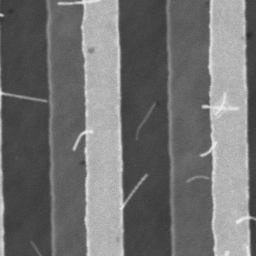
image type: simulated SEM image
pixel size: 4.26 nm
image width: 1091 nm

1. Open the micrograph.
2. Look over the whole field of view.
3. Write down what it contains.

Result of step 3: lines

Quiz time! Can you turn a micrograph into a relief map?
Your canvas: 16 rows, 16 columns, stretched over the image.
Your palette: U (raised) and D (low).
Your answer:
DDDUUUUDDDUUUUUD
DDDUUUUDDDDUUUUD
DDDUUUUDDDDUUUUD
DDDUUUUDDDDUUUUD
DDDUUUUDDDDUUUUD
DDDUUUUUDDDUUUUD
DDDUUUUUDDDUUUUD
DDDUUUUUDDDUUUUD
DDDUUUUUDDDUUUUD
DDDUUUUUDDDUUUUD
DDDUUUUUDDDUUUUD
DDDUUUUUDDDUUUUU
DDDUUUUUDDDUUUUU
DDDUUUUUDDDUUUUU
DDDUUUUUDDDUUUUU
DDDUUUUUDDDUUUUU